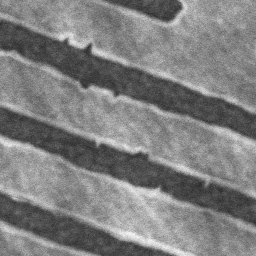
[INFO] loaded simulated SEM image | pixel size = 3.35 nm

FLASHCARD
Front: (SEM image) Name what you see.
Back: one or a few lines or trenches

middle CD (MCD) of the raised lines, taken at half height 0.158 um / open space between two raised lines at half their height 112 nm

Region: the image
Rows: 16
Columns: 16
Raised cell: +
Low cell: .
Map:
+++++++....+++++
.+++++++++++++++
....++++++++++++
+......+++++++++
+++.......++++++
+++++.......++++
+++++++++......+
...+++++++++....
......+++++++++.
+++......+++++++
+++++......+++++
++++++++......++
..+++++++++.....
.....+++++++++..
+......+++++++++
++++......++++++